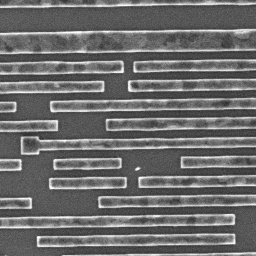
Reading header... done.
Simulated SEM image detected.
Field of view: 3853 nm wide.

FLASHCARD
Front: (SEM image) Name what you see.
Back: wiring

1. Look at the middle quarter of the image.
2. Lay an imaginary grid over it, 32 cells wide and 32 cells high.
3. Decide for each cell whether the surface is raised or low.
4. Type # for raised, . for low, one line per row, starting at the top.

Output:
###############...##############
###############...##############
................................
................................
......####......################
##########......################
##########......################
................................
................................
################################
################################
############....................
................................
................................
...........#####################
...........#####################
...........####....####.........
................................
................................
################################
################################
................................
................................
.............................###
##############...............###
##############...............###
................................
................................
....###########....#############
###############....#############
###############....#############
................................